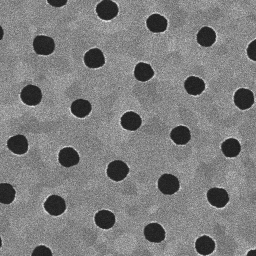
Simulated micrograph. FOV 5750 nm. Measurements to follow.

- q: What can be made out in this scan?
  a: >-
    a regular array of holes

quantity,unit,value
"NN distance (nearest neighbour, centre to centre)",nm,1140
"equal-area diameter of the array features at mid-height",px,20.9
